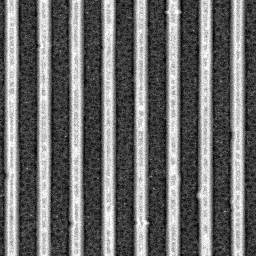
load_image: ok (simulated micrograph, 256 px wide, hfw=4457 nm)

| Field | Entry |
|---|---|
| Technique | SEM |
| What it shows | parallel lines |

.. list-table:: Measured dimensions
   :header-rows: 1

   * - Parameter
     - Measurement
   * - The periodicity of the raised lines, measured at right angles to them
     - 563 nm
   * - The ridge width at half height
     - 10.9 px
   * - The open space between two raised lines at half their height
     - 21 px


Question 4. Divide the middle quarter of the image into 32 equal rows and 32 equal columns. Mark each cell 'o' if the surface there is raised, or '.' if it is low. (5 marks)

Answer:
..oo......oo......ooo.....oo....
..oo......oo......ooo.....oo....
..oo......oo......ooo.....oo....
..oo......oo......ooo.....oo....
..oo......oo......ooo.....oo....
..oo......oo......ooo.....oo....
..oo......oo......ooo.....oo....
..oo......oo......ooo.....oo....
..oo......oo......ooo.....oo....
..oo......oo......ooo.....oo....
..oo......oo......ooo.....oo....
..oo......oo......ooo.....oo....
..oo......oo......ooo.....oo....
..oo......oo......ooo.....oo....
..oo......oo......ooo.....oo....
..oo......oo......ooo.....oo....
..oo......oo......ooo.....oo....
..oo......oo......ooo.....ooo...
..oo......oo......ooo.....ooo...
..oo......oo......ooo.....ooo...
..oo......oo......ooo.....ooo...
..oo......oo......ooo.....ooo...
..oo......oo......ooo.....ooo...
..oo......oo......ooo.....ooo...
..oo......oo......ooo.....ooo...
..oo......oo......ooo.....ooo...
..oo......oo......ooo.....ooo...
..oo......oo......ooo.....ooo...
..oo......oo......ooo.....ooo...
..oo......oo......ooo.....ooo...
..oo......oo......ooo.....ooo...
..oo......oo......ooo.....ooo...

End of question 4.